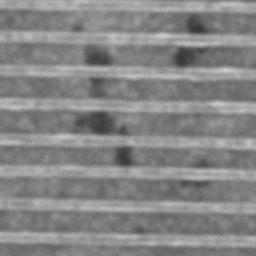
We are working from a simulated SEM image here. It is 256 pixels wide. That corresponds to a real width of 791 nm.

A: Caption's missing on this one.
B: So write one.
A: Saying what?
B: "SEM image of parallel lines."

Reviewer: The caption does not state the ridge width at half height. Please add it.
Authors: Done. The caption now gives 30.1 nm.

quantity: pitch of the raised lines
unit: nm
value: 103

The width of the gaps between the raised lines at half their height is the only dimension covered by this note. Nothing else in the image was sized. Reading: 73.8 nm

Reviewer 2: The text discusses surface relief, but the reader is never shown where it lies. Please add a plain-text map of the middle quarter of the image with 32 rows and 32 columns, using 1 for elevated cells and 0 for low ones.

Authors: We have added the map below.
00000000000000000000000000000000
11111111111111111111111111111111
11111111111111111111111111111111
00000000000000001110000011111001
00000000000000000000000000000000
00000000000000000000000000000000
00000000000000000000000000000000
00000000000000000000000000000000
00000000000000000000000000000000
11111111111111110000000000000000
11111111111111111111111111111111
00000000000011111111111111111111
00000000000000000000000000000000
00000000000000000000000000000000
00000000000000000000000000000000
00000000000000000000000000000000
00000000000000000000000000000000
00000000000000000000000000000000
11111111111111111111111111111000
11111111111111111111111111111111
00000000000000000110010001111111
00000000000000000000000000000000
00000000000000000000000000000000
00000000000000000000000000000000
00000000000000000000000000000000
00000000000000000000000000000000
11111111111111111111111111111111
11111111111111111111111111111111
00000000000000000000011111100111
00000000000000000000000000000000
00000000000000000000000000000000
00000000000000000000000000000000